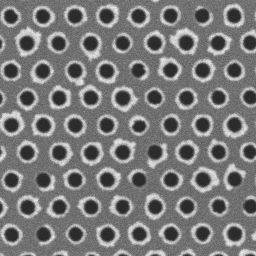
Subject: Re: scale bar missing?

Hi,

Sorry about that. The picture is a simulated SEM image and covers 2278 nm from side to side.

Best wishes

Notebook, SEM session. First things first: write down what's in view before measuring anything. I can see a regular array of holes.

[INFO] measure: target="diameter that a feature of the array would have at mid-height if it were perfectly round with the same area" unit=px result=14.5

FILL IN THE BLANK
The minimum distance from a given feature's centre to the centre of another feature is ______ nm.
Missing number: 279